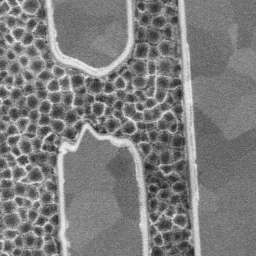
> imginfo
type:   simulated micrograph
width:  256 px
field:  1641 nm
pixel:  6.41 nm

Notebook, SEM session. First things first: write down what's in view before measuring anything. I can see one or a few lines or trenches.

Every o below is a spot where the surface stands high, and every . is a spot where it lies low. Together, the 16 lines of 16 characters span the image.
...ooooo...ooooo
...ooooo...ooooo
...ooooo...ooooo
....oooo....oooo
............oooo
............oooo
............oooo
............oooo
.....o......oooo
....oooo....oooo
....ooooo...oooo
....ooooo...oooo
....ooooo...oooo
....ooooo...oooo
....ooooo...oooo
....ooooo...oooo